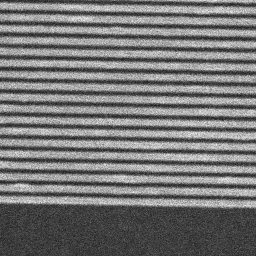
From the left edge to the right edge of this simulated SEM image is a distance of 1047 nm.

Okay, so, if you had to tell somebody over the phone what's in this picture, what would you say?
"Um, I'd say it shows parallel lines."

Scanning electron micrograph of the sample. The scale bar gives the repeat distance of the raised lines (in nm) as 46.5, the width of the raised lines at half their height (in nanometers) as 25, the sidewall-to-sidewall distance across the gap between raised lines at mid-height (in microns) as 0.0215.